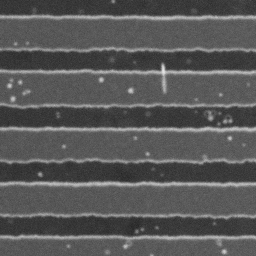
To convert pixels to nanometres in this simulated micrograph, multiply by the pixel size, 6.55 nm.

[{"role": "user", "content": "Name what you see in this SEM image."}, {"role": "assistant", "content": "lines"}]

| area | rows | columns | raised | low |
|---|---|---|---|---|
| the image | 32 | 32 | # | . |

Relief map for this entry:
................................
................................
################################
################################
################################
################################
................................
................................
................................
################################
################################
################################
################################
................................
................................
................................
################################
################################
################################
################################
................................
................................
................................
################################
################################
################################
################################
................................
................................
................................
################################
################################